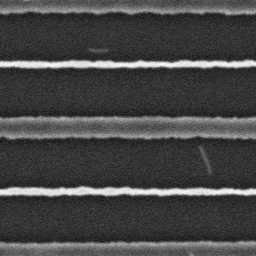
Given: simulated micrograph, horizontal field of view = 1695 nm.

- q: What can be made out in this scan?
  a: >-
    lines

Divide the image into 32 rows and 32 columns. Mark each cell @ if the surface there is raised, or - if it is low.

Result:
@@@@@@@@@@@@@@@@@@@@@@@@@@@@@@@@
@@@--@-@---@@---@--@@@@-@@-@@@@@
--------------------------------
--------------------------------
--------------------------------
--------------------------------
--------------------------------
--------------------------------
--------------------------------
--------------------------------
--------------------------------
--------------------------------
--------------------------------
--------------------------------
--------------------------------
@@@@@@@@@@@@@@@@@@@@@@@@@@@@@@@@
@@@@@@@@@@@@@@@@@@@@@@@@@@@@@@@@
--------------------------------
--------------------------------
--------------------------------
--------------------------------
--------------------------------
--------------------------------
----------@---------------------
--------------------------------
--------------------------------
--------------------------------
--------------------------------
--------------------------------
--------------------------------
@@--@-@@@@@@@@@@@@@@@@@@@@@@@@@@
@@@@@@@@@@@@@@@@@@@@@@@@@@@@@@@@